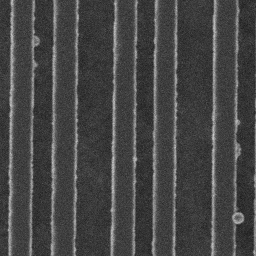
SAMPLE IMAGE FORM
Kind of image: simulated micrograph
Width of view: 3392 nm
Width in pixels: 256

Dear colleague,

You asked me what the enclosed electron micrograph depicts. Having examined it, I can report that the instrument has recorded lines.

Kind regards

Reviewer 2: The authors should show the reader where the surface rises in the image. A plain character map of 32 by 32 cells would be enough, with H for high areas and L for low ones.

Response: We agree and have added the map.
LLHHLLLHHHLLLLHHHLLHHHLLLLLHHHLL
LHHHLLLHHHLLLLHHHLLHHHLLLLLHHHLL
LHHHLLLHHHLLLLHHHLLHHHLLLLLHHHLL
LLHHLLLHHHLLLLHHHLLHHHLLLLLHHHLL
LHHHLLLHHHLLLLHHHLLHHHLLLLLHHHLL
LHHHLLLHHHLLLLHHHLLHHHLLLLLHHHLL
LHHHLLLHHHLLLLHHHLLHHHLLLLLHHHLL
LHHHLLLHHHLLLLHHHLLHHHLLLLLHHHLL
LHHHLLLHHHLLLLHHHLLHHHLLLLLHHHLL
LHHHLLLHHHLLLLHHHLLHHHLLLLLHHHLL
LHHHLLLHHHLLLLHHHLLHHHLLLLLHHHLL
LHHHLLLHHHLLLLHHHLLHHHLLLLLHHHLL
LHHHLLLHHHLLLLHHHLLHHHLLLLLHHHLL
LHHHLLLHHHLLLLHHHLLHHHLLLLLHHHLL
LHHHLLLHHHLLLLHHHLLHHHLLLLLHHHLL
LHHHLLLHHHLLLLHHHLLHHHLLLLLHHHLL
LHHHLLLHHHLLLLHHHLLHHHLLLLLHHHLL
LHHHLLLHHHLLLLHHHLLHHHLLLLLHHLLL
LHHHLLLHHHLLLLHHHLLHHHLLLLLHHHLL
LHHHLLLHHHLLLLHHHLLHHHLLLLLHHHLL
LHHHLLLHHHLLLLHHHLLHHHLLLLLHHLLL
LHHHLLLHHHLLLLHHHLLHHHLLLLLHHLLL
LHHHLLLHHHLLLLHHHLLHHHLLLLLHHLLL
LHHHLLLHHHLLLLHHHLLHHHLLLLLHHLLL
LHHHLLLHHHLLLLHHHLLHHHLLLLLHHLLL
LHHHLLLHHHLLLLHHHLLHHHLLLLLHHLLL
LHHHLLLHHLLLLLHHHLLHHHLLLLLHHHLL
LHHHLLLHHLLLLLHHHLLHHHLLLLLHHHLL
LHHHLLLHHLLLLLHHHLLHHHLLLLLHHLLL
LHHHLLLHHLLLLLHHHLLHHHLLLLLHHLLL
LHHHLLHHHLLLLLHHHLLHHHLLLLHHHLLL
LHHHLLLHHLLLLLHHHLLHHHLLLLHHHLLL